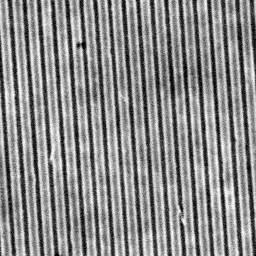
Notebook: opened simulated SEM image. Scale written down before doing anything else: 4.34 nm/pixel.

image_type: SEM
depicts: parallel lines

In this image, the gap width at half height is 4.86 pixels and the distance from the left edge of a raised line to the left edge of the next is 61.5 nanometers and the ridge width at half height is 37.9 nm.